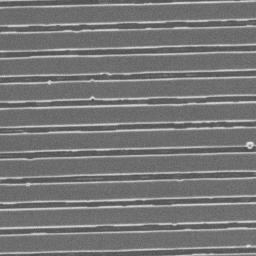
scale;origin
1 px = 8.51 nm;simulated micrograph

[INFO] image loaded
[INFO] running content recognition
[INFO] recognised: parallel lines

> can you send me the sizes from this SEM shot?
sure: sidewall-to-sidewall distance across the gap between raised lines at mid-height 51.1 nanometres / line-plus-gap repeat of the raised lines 215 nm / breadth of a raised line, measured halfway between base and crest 162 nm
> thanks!